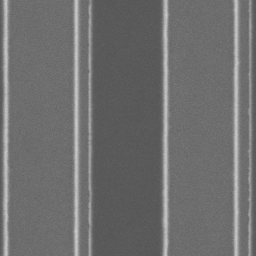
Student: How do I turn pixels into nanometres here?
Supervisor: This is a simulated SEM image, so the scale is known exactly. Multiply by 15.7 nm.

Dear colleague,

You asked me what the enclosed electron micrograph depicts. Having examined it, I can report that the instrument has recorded lines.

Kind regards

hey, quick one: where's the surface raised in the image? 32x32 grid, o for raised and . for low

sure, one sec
o.........ooooooooooo.........oo
o.........ooooooooooo.........oo
o.........ooooooooooo.........oo
o.........ooooooooooo.........oo
o.........ooooooooooo.........oo
o.........ooooooooooo.........oo
o.........ooooooooooo.........oo
o.........ooooooooooo.........oo
o.........ooooooooooo.........oo
o.........ooooooooooo.........oo
o.........ooooooooooo.........oo
o.........ooooooooooo.........oo
o.........ooooooooooo.........oo
o.........ooooooooooo.........oo
o.........ooooooooooo.........oo
o.........ooooooooooo.........oo
o.........ooooooooooo.........oo
o.........ooooooooooo.........oo
o.........ooooooooooo.........oo
o.........ooooooooooo.........oo
o.........ooooooooooo.........oo
o.........ooooooooooo.........oo
o.........ooooooooooo.........oo
o.........ooooooooooo.........oo
o.........ooooooooooo.........oo
o.........ooooooooooo.........oo
o.........ooooooooooo.........oo
o.........ooooooooooo.........oo
o.........ooooooooooo.........oo
o.........ooooooooooo.........oo
o.........ooooooooooo.........oo
o.........ooooooooooo.........oo